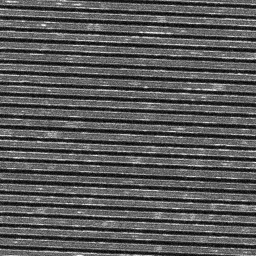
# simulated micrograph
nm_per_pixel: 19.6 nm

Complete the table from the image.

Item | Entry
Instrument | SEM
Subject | parallel lines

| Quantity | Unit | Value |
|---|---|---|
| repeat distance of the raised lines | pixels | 10.9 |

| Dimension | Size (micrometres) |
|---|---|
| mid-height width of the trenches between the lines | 0.103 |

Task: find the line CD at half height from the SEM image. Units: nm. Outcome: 118